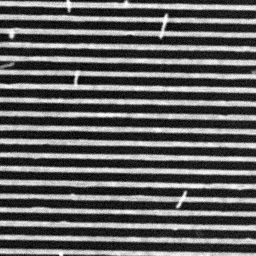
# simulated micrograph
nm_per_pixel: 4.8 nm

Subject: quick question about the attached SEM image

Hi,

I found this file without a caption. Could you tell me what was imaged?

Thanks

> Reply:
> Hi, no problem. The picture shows parallel lines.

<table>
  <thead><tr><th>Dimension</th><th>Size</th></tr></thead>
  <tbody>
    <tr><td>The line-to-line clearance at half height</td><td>49.8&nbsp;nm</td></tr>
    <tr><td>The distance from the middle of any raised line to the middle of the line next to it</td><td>66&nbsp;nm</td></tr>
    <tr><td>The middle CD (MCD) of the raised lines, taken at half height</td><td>16.8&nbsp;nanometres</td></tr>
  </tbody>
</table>